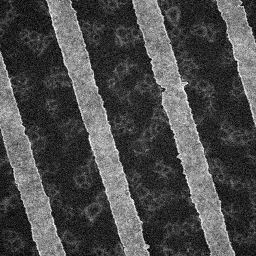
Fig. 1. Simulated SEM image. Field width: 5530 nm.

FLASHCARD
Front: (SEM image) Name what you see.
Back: one or a few lines or trenches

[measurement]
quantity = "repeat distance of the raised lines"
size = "1750 nm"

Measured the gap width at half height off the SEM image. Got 1270 nm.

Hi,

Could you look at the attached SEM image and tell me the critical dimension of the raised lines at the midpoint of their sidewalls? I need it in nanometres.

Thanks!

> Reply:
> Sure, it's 498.